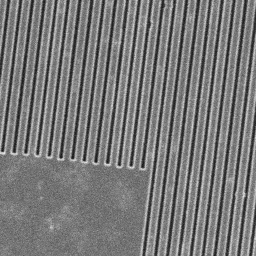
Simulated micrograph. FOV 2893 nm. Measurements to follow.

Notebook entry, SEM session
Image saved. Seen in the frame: parallel lines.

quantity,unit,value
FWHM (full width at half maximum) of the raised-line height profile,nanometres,82.8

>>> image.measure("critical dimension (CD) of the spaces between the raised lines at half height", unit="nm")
51.9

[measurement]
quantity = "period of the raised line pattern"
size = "133 nanometres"